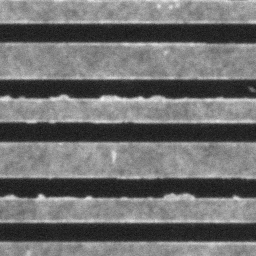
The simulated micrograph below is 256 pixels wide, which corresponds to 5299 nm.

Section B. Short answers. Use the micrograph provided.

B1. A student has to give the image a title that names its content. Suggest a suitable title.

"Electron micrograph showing lines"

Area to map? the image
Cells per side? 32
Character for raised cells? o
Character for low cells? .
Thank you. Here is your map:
oooooooooooooooooooooooooooooooo
oooooooooooooooooooooooooooooooo
oooooooooooooooooooooooooooooooo
................................
................................
ooooooooooooooooo.ooooo.........
oooooooooooooooooooooooooooooooo
oooooooooooooooooooooooooooooooo
oooooooooooooooooooooooooooooooo
oooooooooooooooooooooooooooooooo
................................
................................
oooooooooooooooooo.o..ooooooooo.
oooooooooooooooooooooooooooooooo
oooooooooooooooooooooooooooooooo
................................
................................
................................
oooooooooooooooooooooooooooooooo
oooooooooooooooooooooooooooooooo
oooooooooooooooooooooooooooooooo
oooooooooooooooooooooooooooooooo
................................
................................
................................
oooooooooooooooooooooooooooooooo
oooooooooooooooooooooooooooooooo
oooooooooooooooooooooooooooooooo
................................
................................
oooooooooooooooooooooooooooooooo
oooooooooooooooooooooooooooooooo